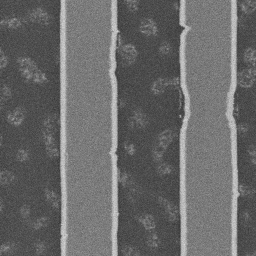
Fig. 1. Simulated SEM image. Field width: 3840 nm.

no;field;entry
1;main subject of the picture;one or a few lines or trenches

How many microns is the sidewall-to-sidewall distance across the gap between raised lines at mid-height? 1.04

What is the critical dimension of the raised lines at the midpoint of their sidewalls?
765 nm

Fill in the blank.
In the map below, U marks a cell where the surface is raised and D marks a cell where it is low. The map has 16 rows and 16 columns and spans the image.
DDDDUUUDDDDUUUUD
DDDDUUUDDDDUUUUD
DDDDUUUDDDDUUUUD
DDDDUUUDDDDUUUUD
DDDDUUUDDDDUUUUD
DDDDUUUDDDDDUUUD
DDDDUUUDDDDDUUDD
DDDDUUUDDDDDUUDD
DDDDUUUDDDDUUUUD
DDDDUUUDDDDUUUUD
DDDDUUUDDDDUUUUD
DDDDUUUDDDDUUUUD
DDDDUUUDDDDUUUUD
DDDDUUUDDDDUUUUD
DDDDUUUDDDDUUUUD
DDDDUUUDDDDUUUUD